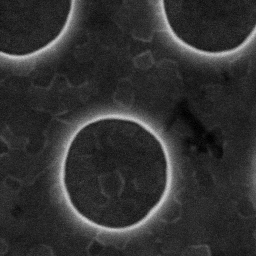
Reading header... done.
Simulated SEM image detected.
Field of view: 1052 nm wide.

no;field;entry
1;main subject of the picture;holes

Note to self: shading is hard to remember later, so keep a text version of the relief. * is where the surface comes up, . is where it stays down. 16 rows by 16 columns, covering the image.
....******......
....*******.....
...********....*
****************
****************
****************
****************
******..********
*****.....******
****......******
****......******
****......******
****......******
*****....*******
****************
****************